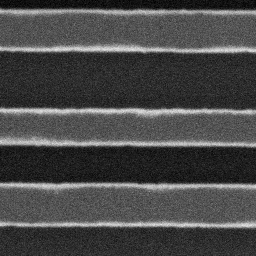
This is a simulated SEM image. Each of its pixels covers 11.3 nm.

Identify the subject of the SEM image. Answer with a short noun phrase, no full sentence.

lines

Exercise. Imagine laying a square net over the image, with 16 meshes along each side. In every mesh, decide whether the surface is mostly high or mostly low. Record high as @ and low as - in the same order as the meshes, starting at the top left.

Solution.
----------------
@@@@@@@@@@@@@@@@
@@@@@@@@@@@@@@@@
----------------
----------------
----------------
----------------
@@@@@@@@@@@@@@@@
@@@@@@@@@@@@@@@@
----------------
----------------
@@@@@@@@@-------
@@@@@@@@@@@@@@@@
@@@@@@@@@@@@@@@@
----------------
----------------